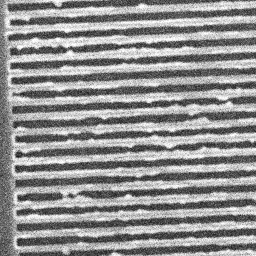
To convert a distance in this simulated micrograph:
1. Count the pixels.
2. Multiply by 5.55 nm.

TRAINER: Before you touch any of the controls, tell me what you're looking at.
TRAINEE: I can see parallel lines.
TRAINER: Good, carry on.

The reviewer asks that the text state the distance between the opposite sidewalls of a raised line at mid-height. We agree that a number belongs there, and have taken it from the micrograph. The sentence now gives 38.8 nm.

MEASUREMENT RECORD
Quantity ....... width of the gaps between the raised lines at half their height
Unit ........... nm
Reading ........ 42.9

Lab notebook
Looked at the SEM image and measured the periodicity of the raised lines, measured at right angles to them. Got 81.3 nm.